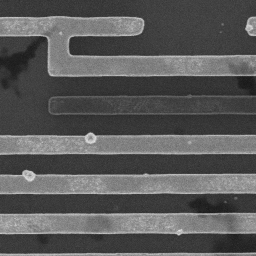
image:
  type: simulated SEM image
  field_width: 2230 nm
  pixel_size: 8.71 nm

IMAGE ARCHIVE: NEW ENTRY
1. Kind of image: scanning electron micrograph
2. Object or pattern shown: wiring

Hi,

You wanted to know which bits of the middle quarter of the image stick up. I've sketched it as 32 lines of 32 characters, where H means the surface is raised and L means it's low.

HHHHHHHHHHHHHHHHHHHHHHHHHHHHHHHH
HHHHHHHHHHHHHHHHHHHHHHHHHHHHHHHH
HHHHHHHHHHHHHHHHHHHHHHHHHHHHHHHH
LLLLLLLLLLLLLLLLLLLLLLLLLLLLLLLL
LLLLLLLLLLLLLLLLLLLLLLLLLLLLLLLL
LLLLLLLLLLLLLLLLLLLLLLLLLLLLLLLL
LLLLLLLLLLLLLLLLLLLLLLLLLLLLLLLL
LLLLLLLLLLLLLLLLLLLLLLLLLLLLLLLL
HHHHHHHHHHHHHHHHHHHHHHHHHHHHHHHH
HHHHHHHHHHHHHHHHHHHHHHHHHHHHHHHH
HHHHHHHHHHHHHHHHHHHHHHHHHHHHHHHH
HHHHHHHHHHHHHHHHHHHHHHHHHHHHHHHH
LLLLLLLHHHHHHLLLLLLLLLLLLLLLLLLL
LLLLLLLLLLLLLLLLLLLLLLLLLLLLLLLL
LLLLLLLLLLLLLLLLLLLLLLLLLLLLLLLL
LLLLLLLLLLLLLLLLLLLLLLLLLLLLLLLL
LLLLLLLLLLLLLLLLLLLLLLLLLLLLLLLL
LLLLLLHLLLLLLLLLLLLLLLLLLLLLLLLL
HHHHHHHHHHHHHHHHHHHHHHHHHHHHHHHH
HHHHHHHHHHHHHHHHHHHHHHHHHHHHHHHH
HHHHHHHHHHHHHHHHHHHHHHHHHHHHHHHH
HHHHHHHHHHHHHHHHHHHHHHHHHHHHHHHH
LLLLLLLLLLLLLLLLLLLLLLLLLLLLLLLL
LLLLLLLLLLLLLLLLLLLLLLLLLLLLLLLL
LLLLLLLLLLLLLLLLLLLLLLLLLLLLLLLL
LLLLLLLLLLLLLLLLLLLLLLLLLLLLLLLL
LLLLLLLLLLLLLLLLLLLLLLLLLLLLLLLL
LLLLLLLLLLLLLLLLLLLLLLLLLLLLLLLL
HHHHHHHHHHHHHHHHHHHHHHHHHHHHHHHH
HHHHHHHHHHHHHHHHHHHHHHHHHHHHHHHH
HHHHHHHHHHHHHHHHHHHHHHHHHHHHHHHH
HHHHHHHHHHHHHHHHHHHHHHHHHHHHHHHH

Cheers